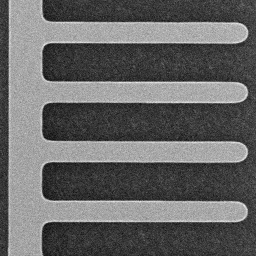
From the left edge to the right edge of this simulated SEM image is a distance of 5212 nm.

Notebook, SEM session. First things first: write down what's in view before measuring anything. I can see groups of lines, slits or small figures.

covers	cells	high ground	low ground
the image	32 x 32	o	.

.oooo...........................
.oooo...........................
.ooooo..........................
.oooooooooooooooooooooooooooooo.
.oooooooooooooooooooooooooooooo.
.ooooo..........................
.oooo...........................
.oooo...........................
.oooo...........................
.oooo...........................
.ooooooooooooooooooooooooooooo..
.oooooooooooooooooooooooooooooo.
.ooooooooooooooooooooooooooooo..
.oooo...........................
.oooo...........................
.oooo...........................
.oooo...........................
.ooooo..........................
.oooooooooooooooooooooooooooooo.
.oooooooooooooooooooooooooooooo.
.ooooo..........................
.oooo...........................
.oooo...........................
.oooo...........................
.oooo...........................
.ooooooooooooooooooooooooooooo..
.oooooooooooooooooooooooooooooo.
.ooooooooooooooooooooooooooooo..
.oooo...........................
.oooo...........................
.oooo...........................
.oooo...........................